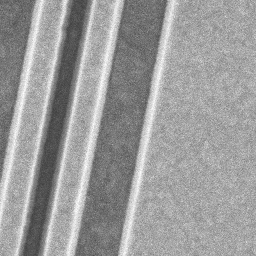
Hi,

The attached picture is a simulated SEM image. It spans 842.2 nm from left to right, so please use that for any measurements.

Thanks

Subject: one or a few lines or trenches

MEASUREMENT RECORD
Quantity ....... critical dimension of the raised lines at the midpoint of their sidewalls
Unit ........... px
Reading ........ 28.5